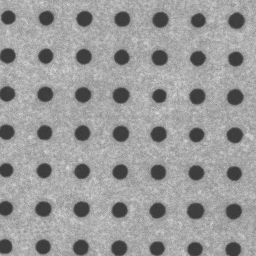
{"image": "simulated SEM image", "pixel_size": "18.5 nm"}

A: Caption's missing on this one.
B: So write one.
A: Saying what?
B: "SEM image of a regular array of holes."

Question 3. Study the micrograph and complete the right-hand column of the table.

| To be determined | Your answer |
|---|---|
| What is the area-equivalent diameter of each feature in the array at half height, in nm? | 300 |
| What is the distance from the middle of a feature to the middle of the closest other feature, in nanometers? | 701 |